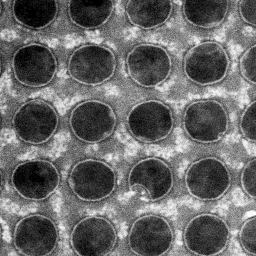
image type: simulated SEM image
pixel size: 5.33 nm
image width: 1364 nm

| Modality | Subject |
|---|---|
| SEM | a regular array of raised bodies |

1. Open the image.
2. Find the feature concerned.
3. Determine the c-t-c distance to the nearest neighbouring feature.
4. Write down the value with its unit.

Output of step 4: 301 nanometers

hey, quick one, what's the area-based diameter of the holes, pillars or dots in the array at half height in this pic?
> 231 nm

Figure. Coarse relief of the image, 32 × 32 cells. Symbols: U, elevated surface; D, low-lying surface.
DDUUUUUDDUUUUUDDUUUUUDDUUUUUDDUU
DDUUUUUDDUUUUUDDUUUUUDDUUUUUDDUU
DDUUUUUDDUUUUDDDUUUUUDDDUUDUDDDU
DDDDUDDDDDDUDDDDDDUDDDDDDDDDDDDD
DDDDDDDDDDDDDDDDDDDDDDDDDDDDDDDD
DDDDDDDDDDDDDDDDDDDDDDDDDUUDDDDD
DDUUUUDDDUUUUUDDUUUUUDDDUUUUDDDU
DDUUUUUDDUUUUUDDUUUUUDDUUUUUDDUU
DDUUUUUDDUUUUUDDUUUUUDDUUUUUDDUU
DDUUUUUDDUUUUUDDUUUUUDDUUUUUDDDU
DDDUUUDDDDDUDDDDDDUUDDDDDDDDDDDD
DDDDDDDDDDDDDDDDDDDDDDDDDDDDDDDD
DDDDDDDDDDDDDDDDDDDDDDDDDDDDDDDD
DDDUUUUDDUUUUUDDDUUUUDDUUUUUDDDU
DDUUUUUDDUUUUUDDUUUUUDDUUUUUDDUU
DDUUUUUDDUUUUUDDUUUUUUDUUUUUDDUU
DDUUUUUDDUUUUUDDUUUUUDDUUUUUDDUU
DDDUUUDDDDUUUDDDDDUUDDDDDUUDDDDU
DDDDDDDDDDDDDDDDDDDDDDDDDDDDDDDD
DDDDDDDDDDDDDDDDDDDDDDDDDDDDDDDD
DDDUUUDDDDUUUDDDDUUUUDDDUUUUDDDU
DDUUUUUDDUUUUUDDUUUUUDDUUUUUUDUU
DDUUUUUDDUUUUUDDUUUUUUDUUUUUUDUU
DDUUUUUDDUUUUUDDDDUUUDDUUUUUDDUU
DDDUUUDDDDUUUDDDDDDUDDDDUUUUDDDU
DDDDDDDDDDDDDDDDDDDDDDDDDDDDDDDD
DDDDDDDDDDDDDDDDDDDDDDDDDDDDDDDD
DDDUUUDDDDUUUDDDDUUUUDDDUUUUDDDU
DDUUUUUDDUUUUUDDUUUUUDDUUUUUUDUU
DDUUUUUDDUUUUUDDUUUUUUDUUUUUUDUU
DDUUUUUDDUUUUUDDUUUUUDDUUUUUDDUU
DDDUUUDDDDUUUUDDDUUUUDDDUUUDDDDU